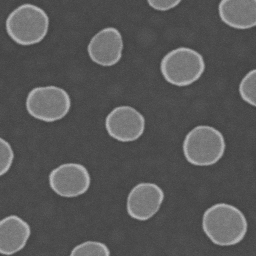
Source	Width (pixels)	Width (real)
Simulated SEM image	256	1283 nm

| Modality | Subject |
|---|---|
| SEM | a regular array of raised bodies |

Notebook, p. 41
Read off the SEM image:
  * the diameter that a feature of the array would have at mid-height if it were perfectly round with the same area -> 187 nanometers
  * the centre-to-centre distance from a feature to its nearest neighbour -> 396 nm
